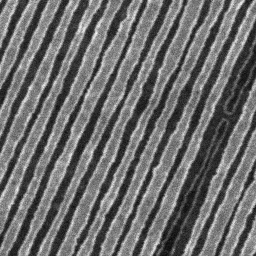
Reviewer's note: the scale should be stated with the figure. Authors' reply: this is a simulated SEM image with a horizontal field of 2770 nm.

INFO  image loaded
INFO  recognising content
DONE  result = parallel lines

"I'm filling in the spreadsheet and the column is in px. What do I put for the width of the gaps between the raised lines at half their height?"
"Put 9.02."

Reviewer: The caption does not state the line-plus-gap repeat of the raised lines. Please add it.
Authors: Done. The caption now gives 201 nanometres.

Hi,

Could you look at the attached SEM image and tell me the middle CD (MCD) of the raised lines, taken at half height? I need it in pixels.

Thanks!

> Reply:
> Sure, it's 9.02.